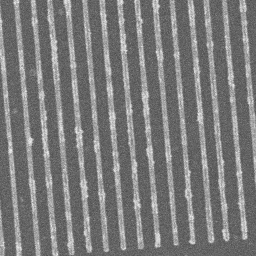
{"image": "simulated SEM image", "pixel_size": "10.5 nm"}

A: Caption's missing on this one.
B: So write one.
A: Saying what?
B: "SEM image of parallel lines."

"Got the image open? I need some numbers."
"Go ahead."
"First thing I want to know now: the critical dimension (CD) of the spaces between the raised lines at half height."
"0.132 µm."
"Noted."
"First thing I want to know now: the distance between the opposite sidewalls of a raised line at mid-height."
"52.2 nanometres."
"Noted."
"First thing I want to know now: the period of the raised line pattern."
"182 nanometres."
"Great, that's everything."